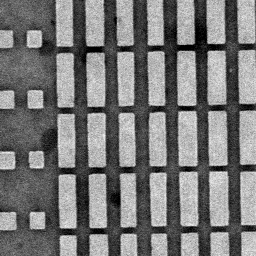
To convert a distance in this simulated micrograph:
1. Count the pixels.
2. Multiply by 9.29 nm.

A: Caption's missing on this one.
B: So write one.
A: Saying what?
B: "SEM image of wiring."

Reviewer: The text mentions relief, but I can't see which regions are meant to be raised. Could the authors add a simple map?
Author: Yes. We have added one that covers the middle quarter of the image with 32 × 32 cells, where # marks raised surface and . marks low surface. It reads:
##....####...####....####...####
##....####...####....####...####
##....####....###....####...####
##....####....###....####...####
##....####....###....####...####
##....####....###....####...####
##....####....###....####...####
##....####....###....####....###
##....####....###....####....###
##....####....###....####....###
##....####......................
................................
......................###....###
##....####....###....####....###
##....####....###....####....###
###...####....###....####....###
###...####....####...####....###
###...####....####...####....###
###...####....####...####....###
###...####....####...####....###
###...####....####...####....###
###...####....####...####....###
###...####....####...####....###
###...####....####...####....###
###...####....####....###....###
###...####....###...............
................................
..............####....###....###
###...####....####....###....###
###...####....####....###....###
###...####....####....###....###
###...####....####....###....###